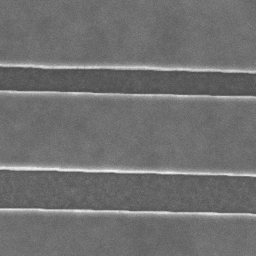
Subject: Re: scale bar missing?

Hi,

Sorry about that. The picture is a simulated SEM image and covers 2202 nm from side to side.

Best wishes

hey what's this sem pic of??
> lines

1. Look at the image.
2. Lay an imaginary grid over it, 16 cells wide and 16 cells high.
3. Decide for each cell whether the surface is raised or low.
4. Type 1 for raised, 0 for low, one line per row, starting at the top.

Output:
1111111111111111
1111111111111111
1111111111111111
1111111111111111
0000000000000001
0000000000000000
1111111111111111
1111111111111111
1111111111111111
1111111111111111
1111111111111111
0000000000000000
0000000000000000
1111111111111111
1111111111111111
1111111111111111